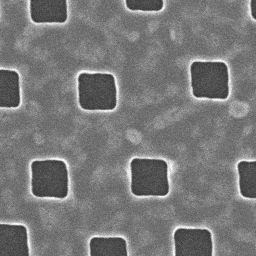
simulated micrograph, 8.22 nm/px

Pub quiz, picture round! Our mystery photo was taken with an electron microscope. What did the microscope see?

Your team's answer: holes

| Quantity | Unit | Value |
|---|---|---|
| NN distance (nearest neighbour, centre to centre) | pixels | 99.5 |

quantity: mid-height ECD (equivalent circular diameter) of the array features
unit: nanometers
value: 342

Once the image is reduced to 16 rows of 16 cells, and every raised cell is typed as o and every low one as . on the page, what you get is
oo..oooo..oooooo
oooooooooooooooo
oooooooooooooooo
oooooooooooooooo
.ooooooooooo..oo
.oooo..ooooo..oo
.oooo..ooooooooo
oooooooooooooooo
oooooooooooooooo
oooooooooooooooo
oo..oooo..ooooo.
oo..oooo...oooo.
oooooooooooooooo
oooooooooooooooo
..ooooooooo..ooo
..oooo..ooo..ooo